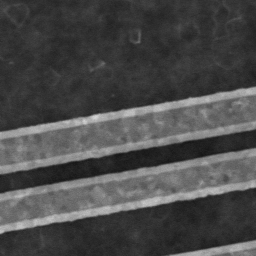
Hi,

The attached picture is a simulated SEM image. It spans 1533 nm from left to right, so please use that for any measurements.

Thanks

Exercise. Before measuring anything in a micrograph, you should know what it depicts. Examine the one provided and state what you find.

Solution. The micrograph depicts one or a few lines or trenches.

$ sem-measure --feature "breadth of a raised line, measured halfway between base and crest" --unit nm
201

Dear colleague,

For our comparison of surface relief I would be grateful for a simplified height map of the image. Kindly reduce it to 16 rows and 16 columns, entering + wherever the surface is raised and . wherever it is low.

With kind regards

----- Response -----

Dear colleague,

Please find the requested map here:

................
................
................
................
................
................
...........+++++
.....+++++++++++
++++++++++++....
+++++++.........
+.........++++++
....++++++++++++
++++++++++......
+++++...........
................
...............+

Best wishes